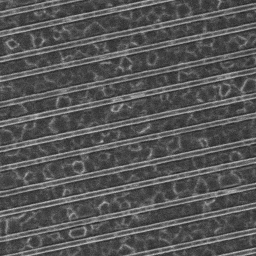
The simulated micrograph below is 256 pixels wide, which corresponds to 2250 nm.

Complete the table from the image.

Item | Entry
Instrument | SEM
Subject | parallel lines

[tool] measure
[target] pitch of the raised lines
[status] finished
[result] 22 px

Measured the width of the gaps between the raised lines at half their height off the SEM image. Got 127 nm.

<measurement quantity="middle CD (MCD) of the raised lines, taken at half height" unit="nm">45.1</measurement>